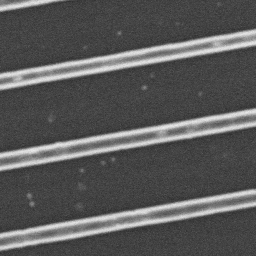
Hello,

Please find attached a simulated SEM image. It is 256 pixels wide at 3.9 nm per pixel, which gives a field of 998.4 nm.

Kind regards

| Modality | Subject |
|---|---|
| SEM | one or a few lines or trenches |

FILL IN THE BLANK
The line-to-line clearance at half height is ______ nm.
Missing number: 255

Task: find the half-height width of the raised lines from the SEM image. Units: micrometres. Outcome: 0.0524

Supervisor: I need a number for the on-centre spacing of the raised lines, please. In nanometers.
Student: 308